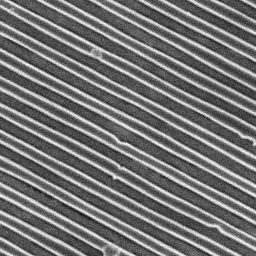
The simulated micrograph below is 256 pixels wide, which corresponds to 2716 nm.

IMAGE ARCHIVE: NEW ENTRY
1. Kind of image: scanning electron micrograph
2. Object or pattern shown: parallel lines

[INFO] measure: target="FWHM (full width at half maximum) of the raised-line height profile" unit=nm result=109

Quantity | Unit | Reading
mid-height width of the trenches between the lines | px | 13.6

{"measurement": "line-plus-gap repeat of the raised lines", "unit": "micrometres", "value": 0.253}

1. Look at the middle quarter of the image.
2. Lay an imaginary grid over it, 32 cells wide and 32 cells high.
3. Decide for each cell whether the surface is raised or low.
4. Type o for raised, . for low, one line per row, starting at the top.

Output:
ooooo.......oooooo......oooooo..
.oooooo.......oooooo......oooooo
...ooooo........ooooo.......oooo
.....ooooo........ooooo.......oo
.......ooooo........ooooo.......
o........ooooo.......oooooo.....
ooo........ooooo........ooooo...
ooooo.......oooooo........oooo..
..ooooo........ooooo.......ooooo
...oooooo........ooooo.......ooo
......ooooo........ooooo.......o
........ooooo.......oooooo......
oo........ooooo.......oooooo....
oooo.......oooooo.......ooooo...
oooooo.......oooooo.......ooooo.
..oooooo.......oooooo.......oooo
....oooooo.......oooooo......ooo
......oooooo.......oooooo......o
o.......ooooo........ooooo......
ooo.......oooo........oooooo....
ooooo.......ooooo.......oooooo..
.oooooo.......oooo........ooooo.
..ooooooo.......oooo........oooo
....ooooooo.......oooo........oo
......oooooo.......ooooo........
o.......oooooo.......ooooo......
ooo.......oooooo.......ooooo....
oooo........ooooo........ooooo..
.ooooo........ooooo........oooo.
..oooooo.......oooooo.......oooo
....oooooo.......ooooo........oo
......oooooo.......ooooo........